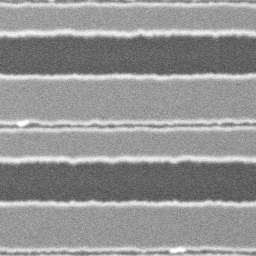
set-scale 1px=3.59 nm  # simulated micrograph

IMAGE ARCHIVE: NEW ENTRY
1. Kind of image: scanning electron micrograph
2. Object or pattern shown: lines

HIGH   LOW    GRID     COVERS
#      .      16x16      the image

################
################
................
................
................
################
################
################
################
################
................
................
................
################
################
################